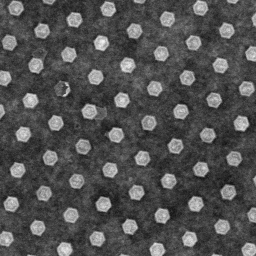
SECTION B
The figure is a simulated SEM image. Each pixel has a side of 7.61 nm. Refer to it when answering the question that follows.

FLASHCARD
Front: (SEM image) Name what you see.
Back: a regular array of raised bodies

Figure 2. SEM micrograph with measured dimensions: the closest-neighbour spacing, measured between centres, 261 nm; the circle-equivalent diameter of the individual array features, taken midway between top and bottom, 111 nm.